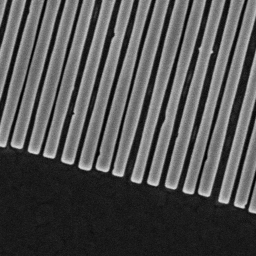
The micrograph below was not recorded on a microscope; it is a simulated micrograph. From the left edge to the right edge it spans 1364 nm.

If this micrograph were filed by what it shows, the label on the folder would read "parallel lines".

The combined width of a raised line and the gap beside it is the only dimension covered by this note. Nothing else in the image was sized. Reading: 93.5 nanometers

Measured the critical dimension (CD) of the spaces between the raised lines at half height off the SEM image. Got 30.9 nanometres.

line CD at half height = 62.6 nm